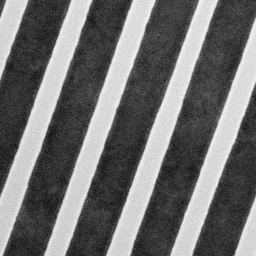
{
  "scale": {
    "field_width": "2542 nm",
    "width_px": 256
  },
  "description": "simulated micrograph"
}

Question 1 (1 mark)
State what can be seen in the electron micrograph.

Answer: lines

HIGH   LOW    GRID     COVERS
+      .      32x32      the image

.++......++......++......++.....
+++.....+++.....+++.....+++.....
+++.....+++.....++......++......
++......++.....+++......++......
++.....+++.....+++.....+++.....+
++.....+++.....+++.....++......+
+......++.....+++......++......+
+.....+++.....+++.....+++.....++
......++......++......++......++
.....+++.....+++.....+++.....+++
.....+++.....+++.....+++.....+++
.....+++.....++......++......++.
....+++.....+++.....+++.....+++.
....+++.....+++.....+++.....+++.
....++......++......++......++..
...+++.....+++.....+++.....+++..
...+++.....+++.....+++.....+++..
...++......++.....+++......++...
..+++.....+++.....+++.....+++...
..+++.....+++.....+++.....+++...
..++......++.....+++.....+++....
.+++.....+++.....+++.....+++....
.+++.....++......+++.....++.....
.++......++.....+++.....+++.....
+++.....+++.....+++.....+++.....
+++.....++......++......++......
++.....+++.....+++.....+++.....+
++.....+++.....+++.....+++.....+
++.....++......++......++......+
+.....+++.....+++.....+++.....++
+.....+++.....+++.....++......++
......++.....+++.....+++.....+++